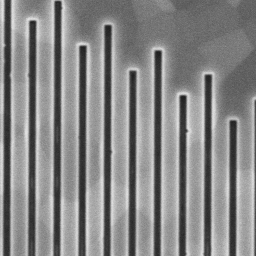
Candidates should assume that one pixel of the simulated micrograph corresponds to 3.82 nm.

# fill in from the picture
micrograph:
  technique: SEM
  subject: parallel lines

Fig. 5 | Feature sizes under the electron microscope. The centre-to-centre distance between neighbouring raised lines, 0.0958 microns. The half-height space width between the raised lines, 0.0296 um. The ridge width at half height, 66.3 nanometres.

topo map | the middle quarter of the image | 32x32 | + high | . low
++++..++++..++++++++++...+++++++
++++..++++..+++++.++++...+++++++
++++..++++..++++..++++...+++++++
++++..++++..++++..++++...+++++++
++++..++++..++++..++++...+++++++
++++..++++..++++..++++...+++++++
++++..++++..++++..++++...+++++++
++++..++++..++++..++++...++++.++
++++..++++..++++..++++...++++..+
++++..++++..++++..++++...++++..+
++++..++++..++++..++++...++++..+
++++..++++..++++..++++...++++..+
++++..++++..++++..++++...++++..+
++++..++++..++++..++++...++++..+
++++..++++..++++..++++...++++..+
++++..++++..++++..++++...++++..+
++++..++++..++++..++++...++++..+
+++...++++..++++..++++...++++..+
+++...++++..++++..++++...++++..+
+++...++++..++++..++++...++++..+
+++...++++..++++..++++...++++..+
+++...++++..++++..++++..+++++..+
+++...++++..++++..++++..+++++..+
+++...++++..++++..++++..+++++..+
+++...++++..++++..++++..+++++..+
+++...++++..++++..++++..+++++..+
+++...++++..++++..++++..+++++..+
+++...++++..++++..++++..+++++..+
+++...++++..++++..++++..+++++..+
+++...++++..++++..++++..+++++..+
+++...++++..++++..++++..+++++..+
+++...++++..++++..++++..+++++..+